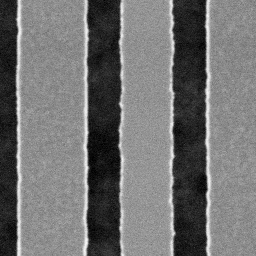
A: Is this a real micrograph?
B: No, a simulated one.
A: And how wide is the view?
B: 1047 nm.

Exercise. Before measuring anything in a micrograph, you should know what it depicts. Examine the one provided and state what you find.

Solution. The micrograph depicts lines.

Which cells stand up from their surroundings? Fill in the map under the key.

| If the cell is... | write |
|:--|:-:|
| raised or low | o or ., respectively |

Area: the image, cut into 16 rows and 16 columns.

.oooo...ooo..ooo
.oooo...ooo..ooo
.oooo...ooo..ooo
.oooo...ooo..ooo
.oooo...ooo..ooo
.oooo...ooo..ooo
.oooo...ooo..ooo
.oooo...ooo..ooo
.oooo...ooo..ooo
.oooo...ooo..ooo
.oooo...ooo..ooo
.oooo...ooo..ooo
.oooo...ooo..ooo
.oooo...ooo..ooo
.oooo...ooo..ooo
.oooo...ooo..ooo